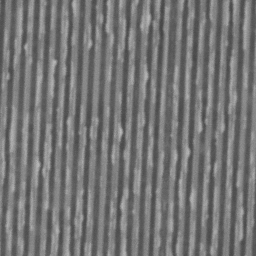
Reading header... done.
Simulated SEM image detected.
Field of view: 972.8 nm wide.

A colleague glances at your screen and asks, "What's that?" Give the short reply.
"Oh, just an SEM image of parallel lines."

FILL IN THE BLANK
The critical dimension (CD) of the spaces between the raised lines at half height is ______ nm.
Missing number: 21.8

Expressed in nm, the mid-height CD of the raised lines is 21.8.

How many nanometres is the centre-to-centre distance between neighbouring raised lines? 43.4